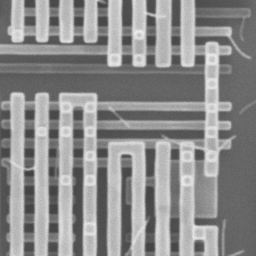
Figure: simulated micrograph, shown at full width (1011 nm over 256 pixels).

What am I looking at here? wiring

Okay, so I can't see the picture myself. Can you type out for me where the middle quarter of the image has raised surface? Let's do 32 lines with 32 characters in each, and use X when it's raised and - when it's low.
-----------XXX----XX---XXX----XX
--------------------------------
--------------------------------
--------------------------------
--------------------------------
--------------------------------
--------------------------------
X-------------------------------
XXXXXXXX------------------------
XXXXXXXX------------------------
XXX-XXXX------------------------
XX---XXX------------------------
XX---XXX------------------------
XX---XXX------------------------
XX---XXX------------------------
XX---XXX------------------------
XX---XXX------------------------
XX---XXX------------------------
XX---XXX------------------------
XX---XXX------------------------
XX---XXX---XXXXXXXXX---XXX---XXX
XX---XXX---XXXXXXXXX---XXX---XXX
XX---XXX---XXXX-XXXX---XXX---XXX
XX---XXX---XXX---XXX---XXX---XXX
XX---XXX---XXX---XXX---XXX---XXX
XX---XXX---XXX---XXX---XXX---XXX
XX---XXX---XXX---XXX---XXX---XXX
XX---XXX---XXX---XXX---XXX---XXX
XX---XXX---XXX---XXX---XXX---XXX
XX---XXX---XXX---XXX---XXX---XXX
XX---XXX---XXX---XXX---XXX---XXX
XX---XXX---XXX---XXX---XXX---XXX